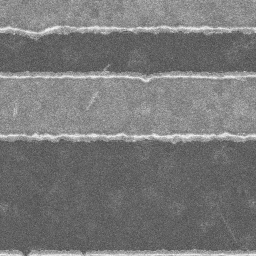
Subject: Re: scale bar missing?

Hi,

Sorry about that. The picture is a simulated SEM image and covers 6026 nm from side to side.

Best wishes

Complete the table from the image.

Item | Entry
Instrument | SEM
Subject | one or a few lines or trenches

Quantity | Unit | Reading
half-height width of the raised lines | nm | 1390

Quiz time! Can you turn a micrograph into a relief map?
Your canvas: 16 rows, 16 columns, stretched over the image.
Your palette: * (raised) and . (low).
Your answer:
****************
****************
................
................
................
****************
****************
****************
....*.*.***....*
................
................
................
................
................
................
................